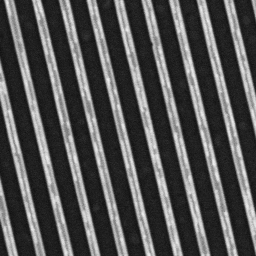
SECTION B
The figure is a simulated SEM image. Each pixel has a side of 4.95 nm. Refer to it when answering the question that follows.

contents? parallel lines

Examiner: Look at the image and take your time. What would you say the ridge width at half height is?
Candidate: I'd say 37.9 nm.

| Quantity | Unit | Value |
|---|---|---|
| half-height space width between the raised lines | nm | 92.2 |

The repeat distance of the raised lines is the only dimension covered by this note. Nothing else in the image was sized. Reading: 132 nanometers